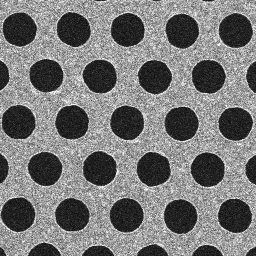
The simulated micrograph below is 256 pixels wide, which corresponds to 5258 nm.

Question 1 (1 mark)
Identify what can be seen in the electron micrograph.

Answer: a regular array of holes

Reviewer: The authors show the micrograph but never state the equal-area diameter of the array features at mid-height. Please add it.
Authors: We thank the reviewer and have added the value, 704 nm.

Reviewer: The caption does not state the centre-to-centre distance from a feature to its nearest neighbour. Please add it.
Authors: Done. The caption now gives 1100 nanometers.